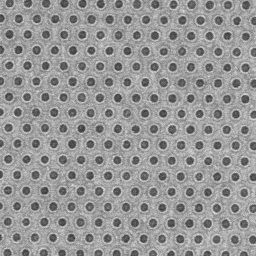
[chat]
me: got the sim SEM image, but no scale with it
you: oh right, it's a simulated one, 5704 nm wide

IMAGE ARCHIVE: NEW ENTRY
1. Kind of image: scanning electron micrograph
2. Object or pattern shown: a regular array of holes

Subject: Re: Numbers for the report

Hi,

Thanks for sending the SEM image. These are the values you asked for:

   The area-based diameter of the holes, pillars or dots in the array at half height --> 0.198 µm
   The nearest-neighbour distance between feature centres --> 396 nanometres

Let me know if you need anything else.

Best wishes